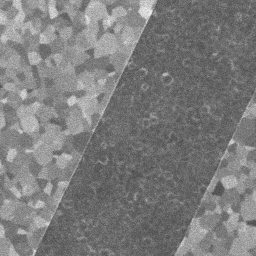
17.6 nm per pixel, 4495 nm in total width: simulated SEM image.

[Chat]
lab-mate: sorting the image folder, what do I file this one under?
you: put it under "one or a few lines or trenches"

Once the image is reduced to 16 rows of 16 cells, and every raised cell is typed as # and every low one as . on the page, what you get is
##########......
#########.......
#########.......
########........
########........
#######.........
#######.........
######.........#
######.........#
#####.........##
#####.........##
####.........###
####.........###
###.........####
###.........####
##.........#####